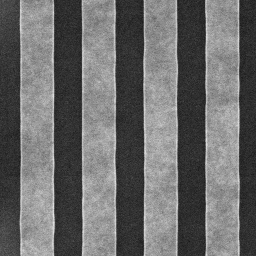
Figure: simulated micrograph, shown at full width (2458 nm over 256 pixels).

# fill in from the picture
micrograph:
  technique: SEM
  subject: groups of lines, slits or small figures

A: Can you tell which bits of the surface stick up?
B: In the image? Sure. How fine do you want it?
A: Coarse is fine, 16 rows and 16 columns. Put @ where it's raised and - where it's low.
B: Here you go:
-@@--@@--@@--@@-
-@@--@@--@@--@@-
-@@--@@--@@--@@-
-@@--@@--@@--@@-
-@@--@@--@@--@@-
-@@--@@--@@--@@-
-@@--@@--@@--@@-
-@@--@@--@@--@@-
-@@--@@--@@--@@-
-@@--@@--@@--@@-
-@@--@@--@@--@@-
-@@--@@--@@--@@-
-@@--@@--@@--@@-
-@@--@@--@@--@@-
-@@--@@--@@--@@-
-@@--@@--@@--@@-